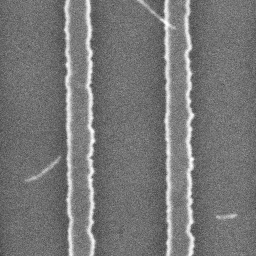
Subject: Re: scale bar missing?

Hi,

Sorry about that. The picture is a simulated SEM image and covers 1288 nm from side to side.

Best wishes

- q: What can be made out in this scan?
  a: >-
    lines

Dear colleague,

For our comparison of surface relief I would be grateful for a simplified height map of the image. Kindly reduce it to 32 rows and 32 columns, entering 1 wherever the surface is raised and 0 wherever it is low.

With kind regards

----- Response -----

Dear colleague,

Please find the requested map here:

00000000111000000000011100000000
00000000111000000000011100000000
00000000111000000000011000000000
00000000111000000000011100000000
00000000111000000000011100000000
00000000111000000000011100000000
00000000111000000000011100000000
00000000111000000000011100000000
00000000111000000000011100000000
00000000111000000000011100000000
00000000111000000000011100000000
00000000111000000000011100000000
00000000111000000000011100000000
00000000111000000000011100000000
00000000111000000000011100000000
00000000111000000000011100000000
00000000111100000000011100000000
00000000111100000000011100000000
00000000011100000000011100000000
00000000111000000000011100000000
00000000111000000000011100000000
00000000111100000000011100000000
00000000111000000000011100000000
00000000011100000000011100000000
00000000111100000000011100000000
00000000111100000000011100000000
00000000111100000000011100000000
00000000011000000000011100000000
00000000011000000000011100000000
00000000011000000000011100000000
00000000011100000000011100000000
00000000011100000000011100000000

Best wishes